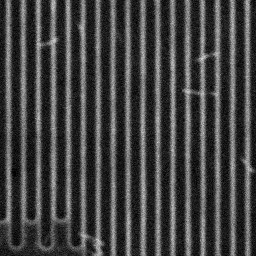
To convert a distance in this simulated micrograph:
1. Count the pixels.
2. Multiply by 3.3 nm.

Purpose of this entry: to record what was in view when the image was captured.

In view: parallel lines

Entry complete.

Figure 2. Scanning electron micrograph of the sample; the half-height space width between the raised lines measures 0.0368 µm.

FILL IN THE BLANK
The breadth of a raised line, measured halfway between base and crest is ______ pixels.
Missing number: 3.88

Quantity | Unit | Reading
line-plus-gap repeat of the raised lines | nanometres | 49.4